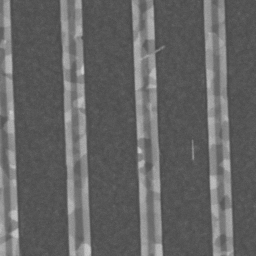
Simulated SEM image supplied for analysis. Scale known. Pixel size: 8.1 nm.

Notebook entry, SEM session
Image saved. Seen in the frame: one or a few lines or trenches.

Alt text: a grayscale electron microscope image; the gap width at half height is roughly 454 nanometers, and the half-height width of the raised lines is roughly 0.123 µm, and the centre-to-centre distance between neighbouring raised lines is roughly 579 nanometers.